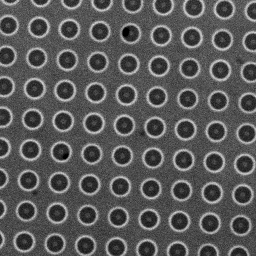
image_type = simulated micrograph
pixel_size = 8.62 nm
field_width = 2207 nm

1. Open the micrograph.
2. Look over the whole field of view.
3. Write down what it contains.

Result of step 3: an array of small figures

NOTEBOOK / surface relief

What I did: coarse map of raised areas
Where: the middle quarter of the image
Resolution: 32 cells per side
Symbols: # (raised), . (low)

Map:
...###.....###....###.....###...
#######..######...####....###...
#######################..#####..
################################
.###############################
..#####..######.################
...###....####....####...#######
..####....###.....###....####...
..####....###.....###....####...
##############...####....####...
##############################..
################################
.######.########################
..####...#####...###############
..###.....###....####....####...
..###.....###....###.....###....
######...####....####....###....
##############..#####...####....
#############################..#
################################
.#####..########################
..###....####...#####..#########
..###....###.....###....####....
.####....###.....###.....###....
######..#####...####....####....
#####################..#####....
################################
################################
.####...#####..#################
.###.....###....####...######.##
.###.....###....####....####...#
#####...####....###.....###.....